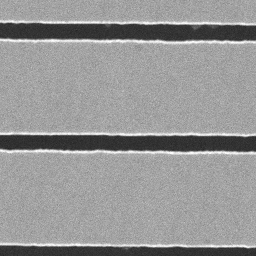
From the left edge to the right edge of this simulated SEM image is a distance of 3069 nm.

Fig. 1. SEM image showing lines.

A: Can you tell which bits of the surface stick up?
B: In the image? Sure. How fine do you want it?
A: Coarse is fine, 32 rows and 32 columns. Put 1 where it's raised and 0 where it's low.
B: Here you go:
11111111111111111111111111111111
11111111111111111111111111111111
11111111111111111111111111111111
00000000000000000000000000000000
00000000000000000000000000000000
11111111111111111111111111111111
11111111111111111111111111111111
11111111111111111111111111111111
11111111111111111111111111111111
11111111111111111111111111111111
11111111111111111111111111111111
11111111111111111111111111111111
11111111111111111111111111111111
11111111111111111111111111111111
11111111111111111111111111111111
11111111111111111111111111111111
11111111111111111111111111111111
00000000000000000000000000000000
00000000000000000000000000000000
11111111111111111111111111111111
11111111111111111111111111111111
11111111111111111111111111111111
11111111111111111111111111111111
11111111111111111111111111111111
11111111111111111111111111111111
11111111111111111111111111111111
11111111111111111111111111111111
11111111111111111111111111111111
11111111111111111111111111111111
11111111111111111111111111111111
11111111111111111111111111111111
00000000000000000000000000000000